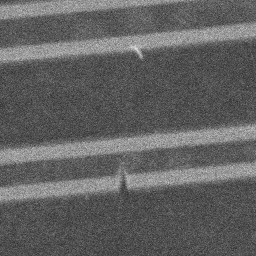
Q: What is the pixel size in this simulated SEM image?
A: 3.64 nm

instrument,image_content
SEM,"one or a few lines or trenches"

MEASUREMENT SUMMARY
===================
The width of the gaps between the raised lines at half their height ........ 360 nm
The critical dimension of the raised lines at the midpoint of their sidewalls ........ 0.143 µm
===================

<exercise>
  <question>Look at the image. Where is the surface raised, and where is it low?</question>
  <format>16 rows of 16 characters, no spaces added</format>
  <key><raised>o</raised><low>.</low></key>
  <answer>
...ooooooooooooo
oooooooooooooooo
oooooooooo......
................
................
................
................
................
.............ooo
...ooooooooooooo
oooooooooooooooo
ooooooo.........
................
................
................
................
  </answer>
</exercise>